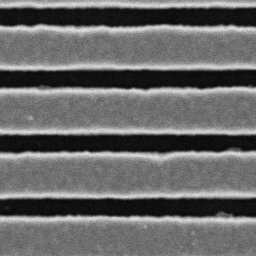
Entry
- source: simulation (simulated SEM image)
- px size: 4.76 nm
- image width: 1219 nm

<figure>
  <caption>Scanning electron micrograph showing lines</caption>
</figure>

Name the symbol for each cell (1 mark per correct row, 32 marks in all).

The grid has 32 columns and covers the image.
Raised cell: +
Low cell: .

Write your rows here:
++++++++++++++++++++++++++++++++
................................
................................
++++++++++++++++++++++++++++++++
++++++++++++++++++++++++++++++++
++++++++++++++++++++++++++++++++
++++++++++++++++++++++++++++++++
++++++++++++++++++++++++++++++++
++++++++++++++++++++++++++++++++
................................
................................
++++++++++++++++++++++++++++++++
++++++++++++++++++++++++++++++++
++++++++++++++++++++++++++++++++
++++++++++++++++++++++++++++++++
++++++++++++++++++++++++++++++++
++++++++++++++++++++++++++++++++
................................
................................
++++++++++++++++++++++++++++++++
++++++++++++++++++++++++++++++++
++++++++++++++++++++++++++++++++
++++++++++++++++++++++++++++++++
++++++++++++++++++++++++++++++++
++++++++++++++++++++++++++++++++
................................
................................
++++++++++++++++++++++++++++++++
++++++++++++++++++++++++++++++++
++++++++++++++++++++++++++++++++
++++++++++++++++++++++++++++++++
++++++++++++++++++++++++++++++++